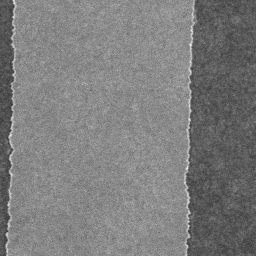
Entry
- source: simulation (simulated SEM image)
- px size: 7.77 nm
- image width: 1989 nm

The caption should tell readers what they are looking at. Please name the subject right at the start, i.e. one or a few lines or trenches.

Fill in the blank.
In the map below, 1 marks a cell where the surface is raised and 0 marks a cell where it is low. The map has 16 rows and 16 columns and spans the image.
0111111111110000
0111111111110000
0111111111110000
0111111111110000
0111111111110000
0111111111110000
0111111111110000
0111111111110000
0111111111110000
0111111111110000
0111111111110000
0111111111110000
0111111111110000
0111111111110000
1111111111111000
1111111111110000